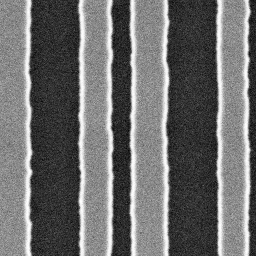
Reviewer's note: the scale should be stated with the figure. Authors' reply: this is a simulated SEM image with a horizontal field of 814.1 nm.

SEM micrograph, lines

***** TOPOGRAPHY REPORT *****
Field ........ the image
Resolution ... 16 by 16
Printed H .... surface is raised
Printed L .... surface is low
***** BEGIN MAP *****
HHLLLHHHHHLLLLHH
HHLLLHHHHHLLLLHH
HHLLLHHHHHLLLLHH
HHLLLHHHHHLLLLHH
HHLLLHHHHHLLLLHH
HHLLLHHHHHLLLLHH
HHLLLHHHHHLLLLHH
HHLLLHHHHHLLLLHH
HHLLLHHHHHLLLLHH
HHLLLHHHHHLLLLHH
HHLLLHHHHHLLLLHH
HHLLLHHHHHLLLLHH
HHLLLHHHHHLLLLHH
HHLLLHHHHHLLLLHH
HHLLLHHHHHLLLLHH
HHLLLHHHHHLLLLHH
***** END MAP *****